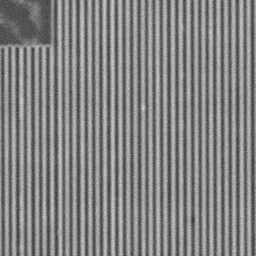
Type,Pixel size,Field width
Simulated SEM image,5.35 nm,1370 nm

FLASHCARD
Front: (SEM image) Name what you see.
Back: parallel lines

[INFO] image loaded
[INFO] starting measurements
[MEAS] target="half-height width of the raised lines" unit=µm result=0.0154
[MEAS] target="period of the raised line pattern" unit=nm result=40.4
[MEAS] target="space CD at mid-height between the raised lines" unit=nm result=26.1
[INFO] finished